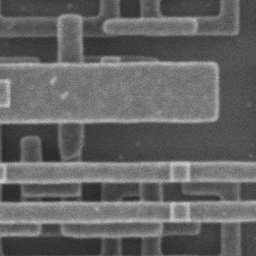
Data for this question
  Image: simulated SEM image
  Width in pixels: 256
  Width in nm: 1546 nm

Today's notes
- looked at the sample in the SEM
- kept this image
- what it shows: wiring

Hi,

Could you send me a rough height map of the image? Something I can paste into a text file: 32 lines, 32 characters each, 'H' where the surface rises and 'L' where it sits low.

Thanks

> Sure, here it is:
LLLLLLLLLLLLLLLLLLLLLLLLLLLLLLLL
LLLLLLLLLLLLLLLLLLLLLLLLLLLLLLLL
LLLLLLLHHHLLLHHHHHHHHHHHLLLLLLLL
LLLLLLLHHHLLLHHHHHHHHHHHHLLLLLLL
LLLLLLLHHHLLLLLLLLLLLLLLLLLLLLLL
LLLLLLLHHHLLLLLLLLLLLLLLLLLLLLLL
LLLLLLLHHHLLLLLLLLLLLLLLLLLLLLLL
LLLLLLLHHHLLLHHLLLLLLLLLLLLLLLLL
HHHHHHHHHHHHHHHHHHHHHHHHHHHLLLLL
HHHHHHHHHHHHHHHHHHHHHHHHHHHLLLLL
HHHHHHHHHHHHHHHHHHHHHHHHHHHLLLLL
HHHHHHHHHHHHHHHHHHHHHHHHHHHLLLLL
HHHHHHHHHHHHHHHHHHHHHHHHHHHLLLLL
HHHHHHHHHHHHHHHHHHHHHHHHHHHLLLLL
HHHHHHHHHHHHHHHHHHHHHHHHHHHLLLLL
LLLLLLLHHHHLLLLLLLLLLLLLLLLLLLLL
LLLLLLLHHHLLLLLLLLLLLLLLLLLLLLLL
LLLHHLLHHHLLLLLLLLLLLLLLLLLLLLLL
LLLHHLLHHHLLLLLLLLLLLLLLLLLLLLLL
LLLHHLLLHHLLLLLLLLLLLLLLLLLLLLLL
HHHHHHHHHHHHHHHHHHHHHHHHHHHHHHHH
HHHHHHHHHHHHHHHHHHHHHHHHHHHHHHHH
HHHHHHHHHHHHHHHHHHHHHHHHHHHHHHHH
LLLHHHHHHHLLLLLLLHHHLLLLLLLLLLLL
LLLHHHHHHLLLLLLLLLHHLLLLLLLLLLLL
HHHHHHHHHHHHHHHHHHHHHHHHHHHHHHHH
HHHHHHHHHHHHHHHHHHHHHHHHHHHHHHHH
HHHHHHHHHHHHHHHHHHHHHHHHHHHHHHHH
HHHHHLLLHHHHHHHHHHHHLLLLLLLLLLLL
HHLLLLLLHHHHHHHHHHHHLLLLLLLLLLLL
LLLLLLLLLLLLLLLLLLLLLLLLLLLLLLLL
LLLLLLLLLLLLLLLLLLLLLLLLLLLLLLLL